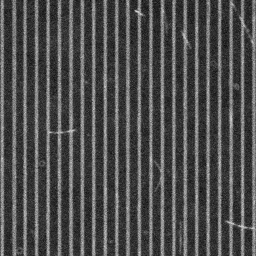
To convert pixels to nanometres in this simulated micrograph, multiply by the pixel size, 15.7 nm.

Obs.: parallel lines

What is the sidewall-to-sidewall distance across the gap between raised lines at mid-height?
0.143 microns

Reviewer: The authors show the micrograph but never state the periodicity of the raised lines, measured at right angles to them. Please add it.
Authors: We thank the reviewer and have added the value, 180 nm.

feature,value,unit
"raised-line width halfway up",37.3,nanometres